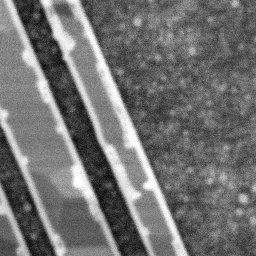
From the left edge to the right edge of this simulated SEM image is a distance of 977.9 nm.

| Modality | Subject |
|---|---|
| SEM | one or a few lines or trenches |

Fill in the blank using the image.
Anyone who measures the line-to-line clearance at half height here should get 0.12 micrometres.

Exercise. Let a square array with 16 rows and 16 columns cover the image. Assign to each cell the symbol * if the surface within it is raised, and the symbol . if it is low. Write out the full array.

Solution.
*..**...........
*..**...........
**..**..........
**..**..........
**...**.........
***..**.........
***..**.........
****..**........
.***..**........
.****..**.......
.****..**.......
..***...**......
..****..**......
*..***..**......
*..****..**.....
**..***..**.....